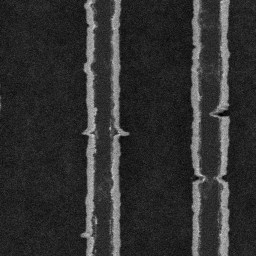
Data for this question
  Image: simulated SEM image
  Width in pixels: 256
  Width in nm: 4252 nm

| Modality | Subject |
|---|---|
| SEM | one or a few lines or trenches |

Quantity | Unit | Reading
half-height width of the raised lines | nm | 485